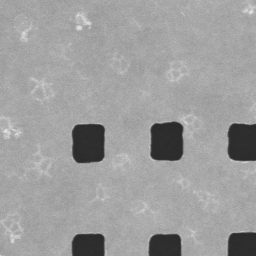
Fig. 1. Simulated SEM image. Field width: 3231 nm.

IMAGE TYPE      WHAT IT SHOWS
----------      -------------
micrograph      holes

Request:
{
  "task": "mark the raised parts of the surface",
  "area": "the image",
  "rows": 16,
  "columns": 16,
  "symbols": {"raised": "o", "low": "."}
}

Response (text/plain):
oooooooooooooooo
oooooooooooooooo
oooooooooooooooo
oooooooooooooooo
oooooooooooooooo
oooooooooooooooo
oooooooooooooooo
oooooooooooooooo
ooooo..oo..ooo..
ooooo..oo..ooo..
oooooooooooooooo
oooooooooooooooo
oooooooooooooooo
oooooooooooooooo
ooooooooooooooo.
oooo...oo..ooo..